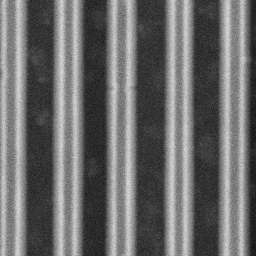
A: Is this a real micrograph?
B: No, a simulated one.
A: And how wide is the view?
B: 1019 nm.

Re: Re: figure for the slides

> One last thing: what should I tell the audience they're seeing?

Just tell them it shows parallel lines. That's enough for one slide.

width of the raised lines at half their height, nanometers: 87.2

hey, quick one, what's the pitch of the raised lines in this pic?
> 221 nm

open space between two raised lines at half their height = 140 nanometers